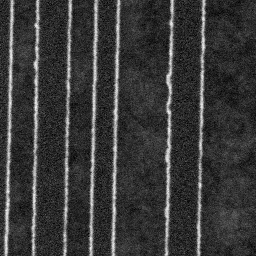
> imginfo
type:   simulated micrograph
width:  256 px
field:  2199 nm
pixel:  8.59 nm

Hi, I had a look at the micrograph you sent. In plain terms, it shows lines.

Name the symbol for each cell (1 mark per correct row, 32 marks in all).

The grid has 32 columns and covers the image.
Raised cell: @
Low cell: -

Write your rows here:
@----@@@@---@@@------@@@@@------
@----@@@@---@@@------@@@@-------
@----@@@@---@@@------@@@@-------
@----@@@@---@@@------@@@@-------
@----@@@@---@@@------@@@@-------
@----@@@@---@@@------@@@@-------
@----@@@@---@@@------@@@@-------
@----@@@@---@@@------@@@@-------
@---@@@@@---@@@------@@@@-------
@----@@@@---@@@------@@@@-------
@----@@@@---@@@------@@@@-------
@----@@@@---@@@------@@@@-------
@----@@@@---@@@------@@@@-------
@----@@@@---@@@------@@@@-------
@----@@@@---@@-------@@@@-------
@----@@@----@@-------@@@@-------
@---@@@@----@@-------@@@@-------
@---@@@@----@@-------@@@@-------
@---@@@@----@@-------@@@@-------
@---@@@@----@@-------@@@@-------
@---@@@@----@@-------@@@@-------
@---@@@@---@@@-------@@@@-------
@---@@@@---@@@-------@@@@-------
@---@@@@---@@@-------@@@@-------
@---@@@@---@@@-------@@@@-------
@---@@@@---@@@-------@@@@-------
@---@@@@---@@@-------@@@@-------
@---@@@@---@@@-------@@@@-------
@---@@@@---@@@-------@@@@-------
@---@@@@---@@@-------@@@@-------
@---@@@@---@@@-------@@@@-------
@---@@@@---@@@-------@@@@-------